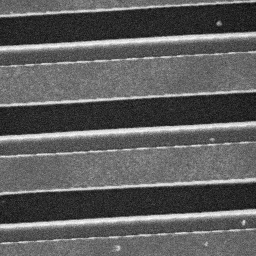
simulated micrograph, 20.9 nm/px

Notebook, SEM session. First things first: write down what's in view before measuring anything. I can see lines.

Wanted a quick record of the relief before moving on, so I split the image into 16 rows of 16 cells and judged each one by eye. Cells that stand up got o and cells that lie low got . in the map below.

oooooooo........
................
..........oooooo
oooooooooooooooo
oooooooooooooooo
oooooooooooooooo
o...............
................
..oooooooooooooo
oooooooooooooooo
oooooooooooooooo
oooooooooo......
................
............oooo
oooooooooooooooo
oooooooooooooooo